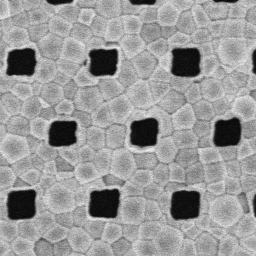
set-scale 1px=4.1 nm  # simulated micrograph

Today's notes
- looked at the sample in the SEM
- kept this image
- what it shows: a regular array of holes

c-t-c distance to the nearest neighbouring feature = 334 nanometres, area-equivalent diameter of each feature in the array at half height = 30.1 pixels